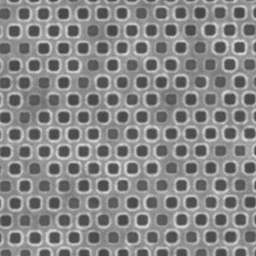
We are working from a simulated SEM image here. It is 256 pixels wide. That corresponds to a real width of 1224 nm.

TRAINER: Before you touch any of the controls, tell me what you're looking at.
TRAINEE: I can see a regular array of holes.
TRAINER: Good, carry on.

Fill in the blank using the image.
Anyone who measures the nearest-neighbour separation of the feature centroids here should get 92.7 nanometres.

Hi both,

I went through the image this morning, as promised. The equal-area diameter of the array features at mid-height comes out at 0.061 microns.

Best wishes